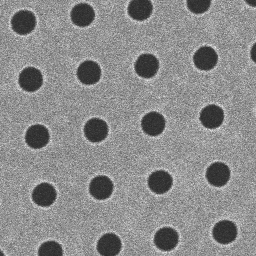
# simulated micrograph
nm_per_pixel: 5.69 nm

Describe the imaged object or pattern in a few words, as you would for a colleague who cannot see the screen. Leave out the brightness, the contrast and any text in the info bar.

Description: a regular array of holes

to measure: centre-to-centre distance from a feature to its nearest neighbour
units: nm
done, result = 328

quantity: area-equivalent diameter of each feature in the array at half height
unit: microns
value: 0.138